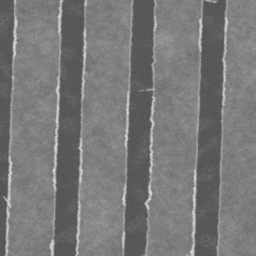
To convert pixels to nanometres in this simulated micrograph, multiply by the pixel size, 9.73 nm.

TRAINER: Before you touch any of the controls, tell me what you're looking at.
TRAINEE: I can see one or a few lines or trenches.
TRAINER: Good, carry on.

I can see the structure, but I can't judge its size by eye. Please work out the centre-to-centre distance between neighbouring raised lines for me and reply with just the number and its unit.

683 nm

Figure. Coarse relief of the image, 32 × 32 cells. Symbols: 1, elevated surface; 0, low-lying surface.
00111111000111111001111110001111
00111111000111110001111110001111
00111111000111110001111110001111
00111111000111110001111110001111
00111111001111110001111110001111
00111111000111110001111110001111
00111111001111110001111110001111
00111110001111110001111110001111
00111110001111110001111110001111
00111110001111110001111110001111
00111110001111110001111110001111
01111110001111110001111110001111
01111110001111110001111110001111
01111110001111110001111110001111
01111110001111110001111110001111
01111110001111110001111110001111
01111110001111110001111110001111
01111110001111110001111110001111
01111110001111110001111110001111
01111110001111110001111110001111
01111110001111110001111110001111
01111110001111110001111100001111
01111110001111110001111100001111
01111110001111110001111100011111
01111110001111110001111100011111
01111110001111110011111100011111
01111110001111110011111100011111
01111110001111110011111100011111
01111110001111110011111100011111
01111110001111110011111100011111
01111110001111100011111100011111
01111110001111100011111100011111